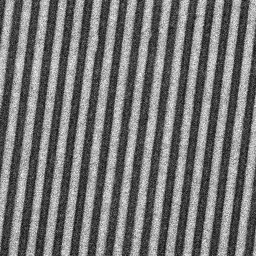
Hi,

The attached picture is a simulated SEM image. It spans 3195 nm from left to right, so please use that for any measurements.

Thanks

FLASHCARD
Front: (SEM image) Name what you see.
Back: parallel lines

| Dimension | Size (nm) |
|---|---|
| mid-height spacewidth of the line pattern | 108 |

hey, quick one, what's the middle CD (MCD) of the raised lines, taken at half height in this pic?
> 8.68 px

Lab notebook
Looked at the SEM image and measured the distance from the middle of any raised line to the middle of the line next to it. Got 216 nm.